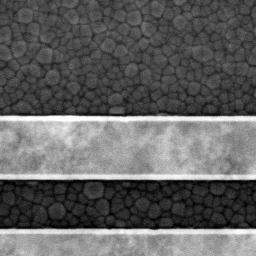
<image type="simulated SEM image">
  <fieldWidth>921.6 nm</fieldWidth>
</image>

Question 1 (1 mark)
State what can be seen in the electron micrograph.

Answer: one or a few lines or trenches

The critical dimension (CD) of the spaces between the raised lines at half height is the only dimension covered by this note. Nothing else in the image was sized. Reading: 0.195 micrometres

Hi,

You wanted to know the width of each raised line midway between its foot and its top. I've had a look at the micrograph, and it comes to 212 nanometers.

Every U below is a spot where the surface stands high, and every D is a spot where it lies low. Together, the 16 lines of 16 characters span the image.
DDDDDDDDDDDDDDDD
DDDDDDDDDDDDDDDD
DDDDDDDDDDDDDDDD
DDDDDDDDDDDDDDDD
DDDDDDDDDDDDDDDD
DDDDDDDDDDDDDDDD
DDDDDDDDDDDDDDDD
UUUUUUUUUUUUUUUU
UUUUUUUUUUUUUUUU
UUUUUUUUUUUUUUUU
UUUUUUUUUUUUUUUU
DDDDDDDDDDDDDDDD
DDDDDDDDDDDDDDDD
DDDDDDDDDDDDDDDD
UUUUUUUUUUUUUUUU
UUUUUUUUUUUUUUUU